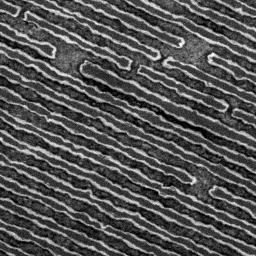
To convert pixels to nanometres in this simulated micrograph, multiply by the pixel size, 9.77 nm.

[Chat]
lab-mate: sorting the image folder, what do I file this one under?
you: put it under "parallel lines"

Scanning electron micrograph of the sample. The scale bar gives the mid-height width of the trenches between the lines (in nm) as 99.8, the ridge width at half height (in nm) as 90.9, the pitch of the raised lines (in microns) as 0.194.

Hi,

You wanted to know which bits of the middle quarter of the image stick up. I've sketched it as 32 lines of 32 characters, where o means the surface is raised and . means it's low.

....ooooo.....ooo..o.....ooooooo
....oooooo.........ooo.......ooo
.....oooooooo......ooooo.......o
oo.....ooooooo.......ooooo......
oooo......ooooooo.......ooooo...
..oooo.....oooooooo.......oooo..
....oooo......oooooo........oooo
......oooooo.....ooooo.......ooo
o.......ooooo.....oooooo........
oooo......oooooo.....oooooo.....
oooooo.......oooo......ooooooo..
..ooooooo......oooooo....ooooooo
.....oooooo......oooooo....ooooo
o......o.oooo......oooooo...oooo
ooo.......oooo.......ooooo.....o
ooooo.......oooooo....oooooo....
.ooooooo.....oooooo......oooooo.
...ooooooo......ooooo.......oooo
......oooooo......ooooo.......oo
oo......oooooo.......oooooo.....
ooo.......ooooo........oooooo...
.ooooo.......ooooo.......ooooo..
...oooooo......ooooo.......ooooo
......oooooo.....ooooo.......ooo
o.......ooooo.......oooo.......o
ooo........oooo......oooooo.....
ooooo.........oooo......ooooo...
..oooooo.......oooo......oooooo.
.....ooooo......ooooo.......oooo
.......oooo......oooooo......ooo
oo......ooooo.......ooooo.......
oooo......oooooo.......ooooo....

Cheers